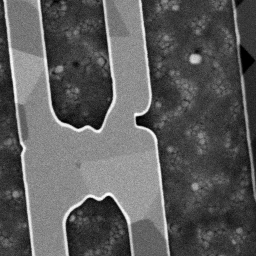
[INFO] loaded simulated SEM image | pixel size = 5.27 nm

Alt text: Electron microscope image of one or a few lines or trenches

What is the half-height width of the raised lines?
193 nanometers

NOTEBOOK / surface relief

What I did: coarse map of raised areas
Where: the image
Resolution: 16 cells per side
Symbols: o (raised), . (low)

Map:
ooo....oo......o
ooo....oo......o
.oo....oo......o
.oo....oo......o
.oo....oo......o
.oo....oo......o
.oo....oo......o
.ooo...oo......o
.ooooooooo......
.ooooooooo......
.ooooooooo......
..oooooooo......
..ooo..ooo......
..oo....oo......
..oo....oo......
..oo....ooo.....